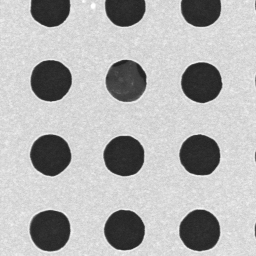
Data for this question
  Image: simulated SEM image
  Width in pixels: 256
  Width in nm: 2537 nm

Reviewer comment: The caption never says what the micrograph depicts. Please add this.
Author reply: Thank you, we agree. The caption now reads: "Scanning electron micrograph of a regular array of holes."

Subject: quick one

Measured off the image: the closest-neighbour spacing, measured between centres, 74.3 pixels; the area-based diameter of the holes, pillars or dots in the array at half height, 411 nm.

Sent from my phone